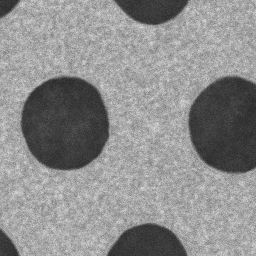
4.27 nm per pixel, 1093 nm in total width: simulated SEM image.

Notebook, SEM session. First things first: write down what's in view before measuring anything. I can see holes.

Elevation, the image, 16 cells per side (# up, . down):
.#######...#####
#########.######
################
################
################
##....#######...
##.....#####....
#......#####....
#......#####....
##....######....
###..########...
################
################
################
########...#####
.######.....####